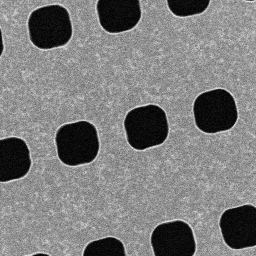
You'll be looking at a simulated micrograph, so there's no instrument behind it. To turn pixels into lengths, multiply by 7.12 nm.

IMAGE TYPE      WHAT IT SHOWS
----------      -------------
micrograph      holes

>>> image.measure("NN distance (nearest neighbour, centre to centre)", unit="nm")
503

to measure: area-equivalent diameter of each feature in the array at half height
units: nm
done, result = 317